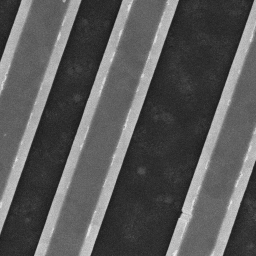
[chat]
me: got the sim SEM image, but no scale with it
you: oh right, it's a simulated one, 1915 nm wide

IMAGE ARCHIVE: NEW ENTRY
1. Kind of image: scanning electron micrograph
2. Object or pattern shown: one or a few lines or trenches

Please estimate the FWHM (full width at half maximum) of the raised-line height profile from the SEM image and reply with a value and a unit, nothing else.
337 nm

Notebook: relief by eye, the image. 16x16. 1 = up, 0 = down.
0111100011100000
0111000111000000
0111000111000001
1111000111000001
1110001110000001
1110001110000011
1110001110000011
1100011100000011
1100011100000111
1100011100000111
1000111000000111
1000111000001110
0000111000001110
0001110000001100
0001110000011100
0001110000011100